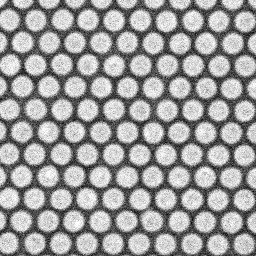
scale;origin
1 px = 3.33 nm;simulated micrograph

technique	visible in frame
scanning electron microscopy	a regular array of raised bodies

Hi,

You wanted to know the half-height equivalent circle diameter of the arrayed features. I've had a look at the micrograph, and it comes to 67.5 nanometres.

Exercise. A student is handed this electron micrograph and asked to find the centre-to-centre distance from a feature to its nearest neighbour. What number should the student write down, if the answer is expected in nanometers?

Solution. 84.7